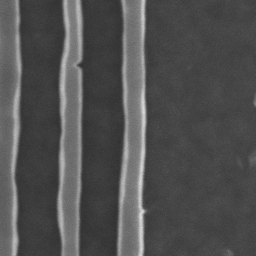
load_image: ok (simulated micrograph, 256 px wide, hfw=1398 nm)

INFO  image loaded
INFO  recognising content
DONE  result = one or a few lines or trenches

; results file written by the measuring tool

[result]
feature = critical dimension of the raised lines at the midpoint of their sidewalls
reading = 102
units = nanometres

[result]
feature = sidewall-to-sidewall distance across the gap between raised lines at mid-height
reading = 0.241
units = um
